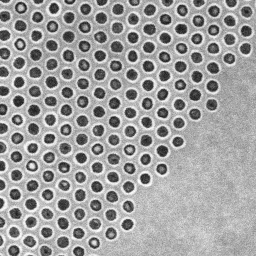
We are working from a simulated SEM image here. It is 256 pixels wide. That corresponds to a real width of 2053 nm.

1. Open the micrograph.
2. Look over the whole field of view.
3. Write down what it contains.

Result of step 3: a regular array of holes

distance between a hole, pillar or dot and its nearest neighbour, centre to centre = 145 nanometers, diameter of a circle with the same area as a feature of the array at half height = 0.0991 µm